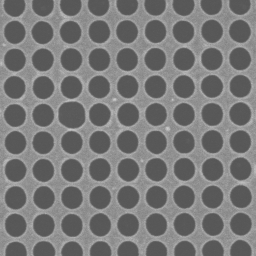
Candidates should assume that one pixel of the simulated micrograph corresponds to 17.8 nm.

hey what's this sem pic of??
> a regular array of holes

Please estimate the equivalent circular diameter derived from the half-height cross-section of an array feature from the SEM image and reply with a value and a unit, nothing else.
22.6 pixels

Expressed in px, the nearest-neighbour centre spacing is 27.4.